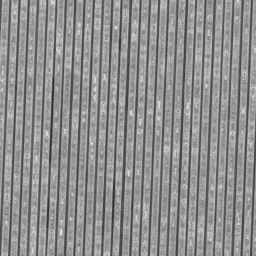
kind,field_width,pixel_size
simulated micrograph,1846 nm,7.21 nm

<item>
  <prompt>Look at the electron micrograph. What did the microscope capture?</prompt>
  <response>parallel lines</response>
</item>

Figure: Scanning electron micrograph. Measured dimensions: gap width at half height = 20.7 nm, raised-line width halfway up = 48.7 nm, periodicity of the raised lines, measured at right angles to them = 67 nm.